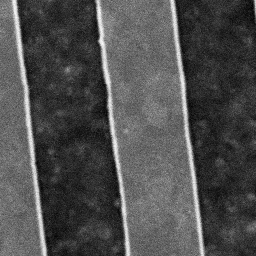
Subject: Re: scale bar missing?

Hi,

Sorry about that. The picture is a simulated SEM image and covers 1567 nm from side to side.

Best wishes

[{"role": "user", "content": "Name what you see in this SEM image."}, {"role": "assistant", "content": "one or a few lines or trenches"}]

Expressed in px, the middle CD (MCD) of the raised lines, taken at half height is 73.6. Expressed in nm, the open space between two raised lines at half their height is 506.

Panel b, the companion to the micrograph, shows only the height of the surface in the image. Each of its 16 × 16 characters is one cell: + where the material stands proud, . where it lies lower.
+.....+++++.....
+.....+++++.....
+.....+++++.....
+......++++.....
+......++++.....
++.....++++.....
++.....+++++....
++.....+++++....
++.....+++++....
++.....+++++....
++.....+++++....
++......++++....
++......++++....
++......++++....
+++.....++++....
+++.....+++++...